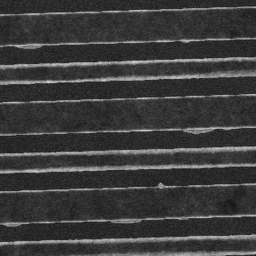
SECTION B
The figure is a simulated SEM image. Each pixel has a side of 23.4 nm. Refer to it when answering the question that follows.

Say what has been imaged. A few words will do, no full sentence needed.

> lines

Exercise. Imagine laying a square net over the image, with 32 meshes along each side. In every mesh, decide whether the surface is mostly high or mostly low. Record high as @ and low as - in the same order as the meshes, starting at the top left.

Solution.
--------------------------------
-------------@@@@@@@@@@@@@@@@@@@
@@@@@@@@@@@@@@@@@@@@@@@@@@@@@@@@
@@@@@@@@@@@@@@@@@@@@@@@@@@@@@@@@
@@@@@@@@@@@@@@@@@@@@@@@@@@@@@@@@
@@@@@@@-------------------------
--------------------------------
-------------------------@@@@@@@
@@@@@@@@@@@@@@@@@@@@@@@@@@@@@@@@
@@@@@@@@@@@@@@@@@@@@@@@@@@------
--------------------------------
--------------------------------
-----------@@@@@@@@@@@@@@@@@@@@@
@@@@@@@@@@@@@@@@@@@@@@@@@@@@@@@@
@@@@@@@@@@@@@@@@@@@@@@@@@@@@@@@@
@@@@@@@@@@@@@@@@@@@@@@@@@@@@@@@@
@@@@@@@@@@@@--------------------
--------------------------------
--------------------------------
@@@@@@@@@@@@@@@@@@@@@@@@@@@@@@@@
@@@@@@@@@@@@@@@@@@@@@@@@@@@@@@@@
--------------------------------
--------------------------------
----------------@@@@@@@@@@@@@@@@
@@@@@@@@@@@@@@@@@@@@@@@@@@@@@@@@
@@@@@@@@@@@@@@@@@@@@@@@@@@@@@@@@
@@@@@@@@@@@@@@@@@@@@@@@@@@@@@@@@
@@@@@@@@@@@@@@@@----------------
--------------------------------
--------------------------------
@@@@@@@@@@@@@@@@@@@@@@@@@@@@@@@@
@@@@@@@@@@@@@@@@@@@@@@@@@@@@@@@@